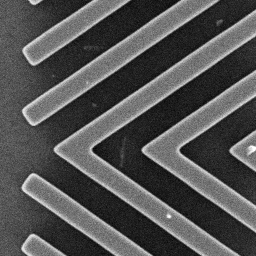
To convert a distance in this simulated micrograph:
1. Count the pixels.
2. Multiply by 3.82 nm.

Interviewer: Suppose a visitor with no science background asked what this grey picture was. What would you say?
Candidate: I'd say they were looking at groups of lines, slits or small figures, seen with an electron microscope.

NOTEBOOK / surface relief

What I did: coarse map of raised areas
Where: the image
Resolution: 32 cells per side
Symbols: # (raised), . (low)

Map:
...........#####......#####.....
.........#####......#####.......
........#####......#####......##
......#####.......####.......###
.....#####......#####......#####
....####.......####.......####..
...####......#####......#####...
....#.......####.......#####....
..........#####......#####......
.........#####......#####......#
.......#####......#####......###
......#####......#####......####
....#####......#####......#####.
...#####......#####......#####..
...###.......####.......####....
....#......#####......#####.....
..........####.......####.......
........#####......#####......##
.......#####......#####......###
........####......#####......###
.........#####......####.......#
..........#####......#####......
...###......####.......####.....
...####......#####......#####...
....#####......####......#####..
.....#####......#####......#####
.......####.......####......####
........#####......#####......##
.........#####......#####......#
....#......#####......####......
...###......#####......#####....
...#####......####......#####...